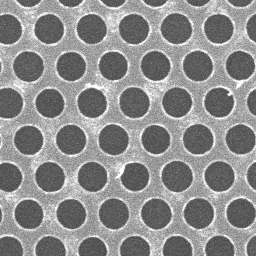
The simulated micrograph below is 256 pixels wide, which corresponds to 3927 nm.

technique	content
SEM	a regular array of holes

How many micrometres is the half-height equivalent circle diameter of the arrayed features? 0.468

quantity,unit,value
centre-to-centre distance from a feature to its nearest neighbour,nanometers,645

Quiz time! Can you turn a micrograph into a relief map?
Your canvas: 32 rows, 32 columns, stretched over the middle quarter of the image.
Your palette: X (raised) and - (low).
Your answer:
------XXX-------XXX--------XXX--
-----XXXX-------XXX--------XXX--
-----XXXX------XXXXX------XXXX--
----XXXXXX----XXXXXXX----XXXXXX-
X-XXXXXXXXXXXXXXXXXXXXXXXXXXXXXX
XXXXXXXXXXXXXXXXXXXXXXXXXXXXXXXX
XXXXX----XXXXXX-----XXXXXX-----X
XXXX------XXXX-------XXXX-------
XXX-------XXXX-------XXXX-------
XXX--------XXX--------XX--------
XXX--------XXX-------XXXX-------
XXXX------XXXX-------XXXX-------
XXXX------XXXXX-----XXXXXX-----X
XXXXXXXXXXXXXXXXX-XXXXXXXXXX-XXX
XXXXXXXXXXXXXXXXXXXXXXXXXXXXXXXX
---XXXXXXX----XXXXXXX---XXXXXXXX
-----XXXX------XXXXX------XXXX--
-----XXXX-------XXX-------XXXX--
------XX--------XXX--------XXX--
------XX--------XXX--------XXX--
-----XXXX-------XXXX------XXXX--
-----XXXX------XXXXX------XXXXX-
---XXXXXXXX---XXXXXXXX--XXXXXXXX
XXXXXXXXXXXXXXXXXXXXXXXXXXXXXXXX
XXXXXX--XXXXXXXXXXXXXXXXXXX---XX
XXXX-----XXXXXX-----XXXXX------X
XXXX------XXXXX------XXX--------
XXX--------XXX-------XXX--------
XXX--------XXX-------XXX--------
XXXX-------XXX-------XXX--------
XXXX------XXXXX------XXXX-------
XXXXX----XXXXXXX----XXXXXX----XX